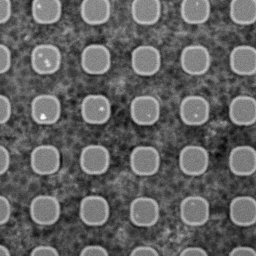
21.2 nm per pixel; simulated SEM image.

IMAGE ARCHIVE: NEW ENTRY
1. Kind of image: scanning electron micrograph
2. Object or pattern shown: a regular array of raised bodies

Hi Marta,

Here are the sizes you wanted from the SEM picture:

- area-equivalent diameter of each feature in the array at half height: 616 nm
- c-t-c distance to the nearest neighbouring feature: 1050 nm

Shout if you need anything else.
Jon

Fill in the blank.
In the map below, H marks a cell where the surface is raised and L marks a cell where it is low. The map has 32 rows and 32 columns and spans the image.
HLLLHHHLLLHHHHLLLHHHLLLHHHLLLHHH
HLLLHHHLLLHHHHLLLHHHLLLHHHLLLHHH
HLLLLHHLLLLHHLLLLHHHLLLHHHLLLHHH
LLLLLLLLLLLLLLLLLLLLLLLLLLLLLLLL
LLLLLLLLLLLLLLLLLLLLLLLLLLLLLLLL
LLLLLLLLLLLLLLLLLLLLLLLLLLLLLLLL
HLLLHHHLLLHHHHLLLHHHLLLHHHLLLHHH
HLLLHHHLLLHHHHLLLHHHLLLHHHLLLHHH
HLLLHHHLLLHHHLLLLHHHLLLHHHLLLHHH
LLLLLLLLLLLLLLLLLLLLLLLLLLLLLLLL
LLLLLLLLLLLLLLLLLLLLLLLLLLLLLLLL
LLLLLLLLLLLLLLLLLLLLLLLLLLLLLLLL
HLLLHHHLLLLHHLLLLHHLLLLHHLLLLHHH
HLLLHHHLLLHHHHLLHHHHLLLHHHLLLHHH
HLLLHHHLLLHHHHLLHHHHLLLHHHLLLHHH
LLLLLLLLLLLLLLLLLLLLLLLLLLLLLLHL
LLLLLLLLLLLLLLLLLLLLLLLLLLLLLLLL
LLLLLLLLLLLLLLLLLLLLLLLLLLLLLLLL
LLLLLHHLLLLHHLLLLHHLLLLHHLLLLLHL
HLLLHHHLLLHHHHLLHHHHLLLHHHLLLHHH
HLLLHHHLLLHHHHLLHHHHLLLHHHLLLHHH
LLLLLHHLLLLHHLLLLHHLLLLHHLLLLHHH
LLLLLLLLLLLLLLLLLLLLLLLLLLLLLLLL
LLLLLLLLLLLLLLLLLLLLLLLLLLLLLLLL
LLLLLLLLLLLLLLLLLLLLLLLLLLLLLLLL
HLLLHHHLLLHHHLLLLHHHLLLHHHLLLHHH
HLLLHHHLLLHHHHLLHHHHLLLHHHLLLHHH
HLLLHHHLLLHHHLLLLHHHLLLHHHLLLHHH
LLLLLLLLLLLLLLLLLLLLLLLLLLLLLLLL
LLLLLLLLLLLLLLLLLLLLLLLLLLLLLLLL
LLLLLLLLLLLLLLLLLLLLLLLLLLLLLLLL
HLLLHHHLLLHHHLLLLHHLLLLHHLLLLHHH